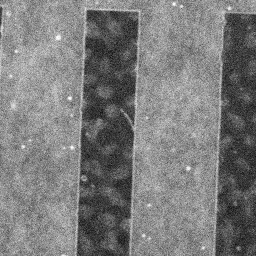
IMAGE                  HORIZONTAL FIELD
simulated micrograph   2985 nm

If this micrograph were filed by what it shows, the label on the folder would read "one or a few lines or trenches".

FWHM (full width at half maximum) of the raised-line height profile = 632 nanometers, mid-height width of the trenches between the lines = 980 nm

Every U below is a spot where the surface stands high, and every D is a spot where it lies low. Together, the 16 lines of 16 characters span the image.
DDDDDDDDDDDDDDDD
DDDDDDUUUDDDDDUU
DDDDDUUUUDDDDDUU
DDDDDUUUUDDDDDUU
DDDDDUUUUDDDDDUU
DDDDDUUUUDDDDDUU
DDDDDUUUDDDDDDUU
DDDDDUUUDDDDDDUU
DDDDDUUUDDDDDDUU
DDDDDUUUDDDDDDUU
DDDDDUUUDDDDDDUU
DDDDDUUUDDDDDDUU
DDDDDUUUDDDDDDUU
DDDDDUUUDDDDDUUU
DDDDDUUUDDDDDUUU
DDDDDUUUDDDDDUUU